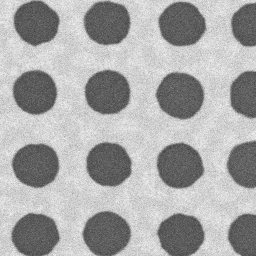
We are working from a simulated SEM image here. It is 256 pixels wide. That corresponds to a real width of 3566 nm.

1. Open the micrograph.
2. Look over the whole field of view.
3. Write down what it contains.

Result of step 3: a regular array of holes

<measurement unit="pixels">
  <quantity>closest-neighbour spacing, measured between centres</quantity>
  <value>70.6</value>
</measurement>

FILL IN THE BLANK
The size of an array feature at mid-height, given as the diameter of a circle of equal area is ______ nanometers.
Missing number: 631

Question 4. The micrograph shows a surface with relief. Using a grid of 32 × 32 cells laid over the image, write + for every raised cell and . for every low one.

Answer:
+++...++++++...++++++...+++++++.
++.....++++.....++++.....++++...
++.....++++.....++++......+++...
++.....++++.....++++......+++...
++.....++++.....++++.....++++...
++++.++++++++.+++++++...++++++..
++++++++++++++++++++++++++++++++
++++++++++++++++++++++++++++++++
++++++++++++++++++++++++++++++++
+++...++++++...++++++...++++++..
++.....++++.....++++.....++++...
++.....++++.....++++.....++++...
++.....++++.....++++.....++++...
+++...+++++.....++++.....++++...
+++++++++++++++++++++...+++++++.
++++++++++++++++++++++++++++++++
++++++++++++++++++++++++++++++++
++++++++++++++++++++++++++++++++
+++...++++++...++++++...+++++...
++.....++++.....++++.....++++...
++.....++++.....++++.....+++....
++.....++++.....++++.....++++...
++.....+++++....++++.....++++...
++++++++++++++++++++++.+++++++++
++++++++++++++++++++++++++++++++
++++++++++++++++++++++++++++++++
++++++++++++..++++++++++++++++++
++.....++++.....+++++....++++...
++.....++++.....++++.....++++...
+......+++......++++......+++...
++.....++++.....++++.....++++...
++....++++++...++++++...+++++...